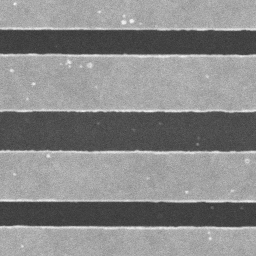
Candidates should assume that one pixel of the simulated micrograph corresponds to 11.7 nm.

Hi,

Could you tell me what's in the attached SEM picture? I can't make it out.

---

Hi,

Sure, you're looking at lines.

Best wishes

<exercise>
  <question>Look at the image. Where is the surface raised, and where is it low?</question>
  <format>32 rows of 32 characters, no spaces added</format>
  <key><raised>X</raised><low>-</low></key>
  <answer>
XXXXXXXXXXXXXXXXXXXXXXXXXXXXXXXX
XXXXXXXXXXXXXXXXXXXXXXXXXXXXXXXX
XXXXXXXXXXXXXXXXXXXXXXXXXXXXXXXX
XXXXXXXXXXXXXXXXXXXXXXXXXXXXXXXX
--------------------------------
--------------------------------
--------------------------------
XXXXXXXXXXXXXXXXXXXXXXXXXXXXXXXX
XXXXXXXXXXXXXXXXXXXXXXXXXXXXXXXX
XXXXXXXXXXXXXXXXXXXXXXXXXXXXXXXX
XXXXXXXXXXXXXXXXXXXXXXXXXXXXXXXX
XXXXXXXXXXXXXXXXXXXXXXXXXXXXXXXX
XXXXXXXXXXXXXXXXXXXXXXXXXXXXXXXX
XXXXXXXXXXXXXXXXXXXXXXXXXXXXXXXX
--------------------------------
--------------------------------
--------------------------------
--------------------------------
--------------------------------
XXXXXXXXXXXXXXXXXXXXXXXXXXXXXXXX
XXXXXXXXXXXXXXXXXXXXXXXXXXXXXXXX
XXXXXXXXXXXXXXXXXXXXXXXXXXXXXXXX
XXXXXXXXXXXXXXXXXXXXXXXXXXXXXXXX
XXXXXXXXXXXXXXXXXXXXXXXXXXXXXXXX
XXXXXXXXXXXXXXXXXXXXXXXXXXXXXXXX
--------------------------------
--------------------------------
--------------------------------
XXXXXXXXXXXXXXXXXXXXXXXXXXXXXXXX
XXXXXXXXXXXXXXXXXXXXXXXXXXXXXXXX
XXXXXXXXXXXXXXXXXXXXXXXXXXXXXXXX
XXXXXXXXXXXXXXXXXXXXXXXXXXXXXXXX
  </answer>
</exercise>